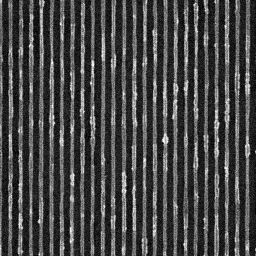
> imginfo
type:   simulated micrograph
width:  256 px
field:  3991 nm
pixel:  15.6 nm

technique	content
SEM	parallel lines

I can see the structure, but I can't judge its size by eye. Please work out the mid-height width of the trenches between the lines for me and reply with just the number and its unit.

113 nm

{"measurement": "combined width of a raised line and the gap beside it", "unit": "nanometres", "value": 161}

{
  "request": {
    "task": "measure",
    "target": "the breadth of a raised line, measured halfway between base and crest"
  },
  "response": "48.7 nm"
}